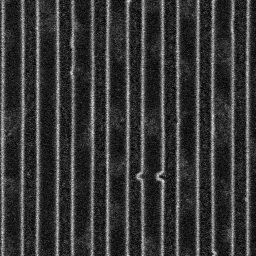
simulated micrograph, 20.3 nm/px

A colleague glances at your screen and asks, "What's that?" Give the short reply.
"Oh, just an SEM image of parallel lines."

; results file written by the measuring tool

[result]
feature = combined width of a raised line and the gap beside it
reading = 710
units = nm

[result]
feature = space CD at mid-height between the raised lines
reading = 291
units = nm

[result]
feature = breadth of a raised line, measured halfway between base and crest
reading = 428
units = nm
